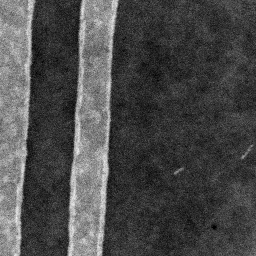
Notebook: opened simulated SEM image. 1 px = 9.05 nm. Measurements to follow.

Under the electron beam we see one or a few lines or trenches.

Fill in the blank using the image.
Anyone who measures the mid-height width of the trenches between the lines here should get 453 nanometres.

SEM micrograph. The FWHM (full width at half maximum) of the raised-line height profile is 294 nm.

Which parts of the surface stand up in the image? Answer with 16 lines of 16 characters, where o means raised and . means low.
oo...oo.........
oo...oo.........
oo...oo.........
oo...oo.........
oo...oo.........
oo...oo.........
oo...oo.........
oo...oo.........
oo...oo.........
oo...oo.........
o....oo.........
o...ooo.........
o...ooo.........
o...oo..........
o...oo..........
o...oo..........